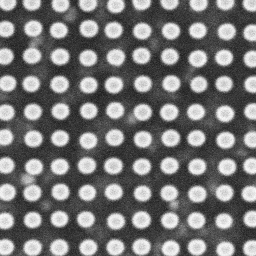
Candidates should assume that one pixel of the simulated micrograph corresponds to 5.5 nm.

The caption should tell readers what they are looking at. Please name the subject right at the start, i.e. a regular array of raised bodies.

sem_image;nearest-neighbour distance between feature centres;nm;144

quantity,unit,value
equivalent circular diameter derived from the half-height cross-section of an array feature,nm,83